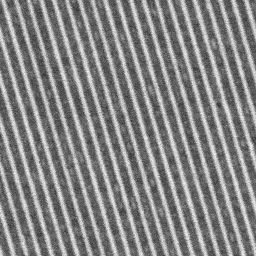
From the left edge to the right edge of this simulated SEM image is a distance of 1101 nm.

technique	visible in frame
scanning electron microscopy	parallel lines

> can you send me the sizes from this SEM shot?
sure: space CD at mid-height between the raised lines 41.8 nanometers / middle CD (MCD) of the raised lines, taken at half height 0.0114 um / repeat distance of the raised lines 52.7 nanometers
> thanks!